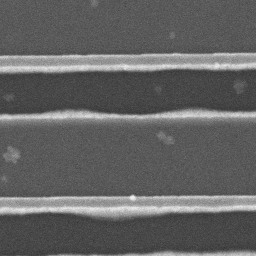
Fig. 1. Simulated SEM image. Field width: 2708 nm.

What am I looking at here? lines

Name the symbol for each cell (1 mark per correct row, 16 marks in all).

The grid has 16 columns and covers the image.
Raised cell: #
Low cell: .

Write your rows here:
################
################
################
################
................
................
................
################
################
################
################
################
################
................
................
................